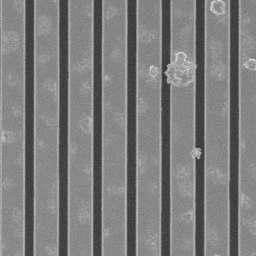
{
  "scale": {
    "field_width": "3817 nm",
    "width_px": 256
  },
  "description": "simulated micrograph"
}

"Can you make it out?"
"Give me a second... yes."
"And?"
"parallel lines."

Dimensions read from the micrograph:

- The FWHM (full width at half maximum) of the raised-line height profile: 0.354 microns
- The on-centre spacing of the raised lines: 508 nm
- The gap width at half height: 9.88 px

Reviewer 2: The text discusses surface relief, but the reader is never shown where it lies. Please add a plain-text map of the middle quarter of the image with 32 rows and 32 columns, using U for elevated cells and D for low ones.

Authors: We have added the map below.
DUUUUUUDDDUUUUUDDDUUUUUUDDUUUUUU
DUUUUUUDDDUUUUUDDDUUUUUUDDUUUUUU
DUUUUUUDDDUUUUUDDDUUUUUUDUUUUUUU
DUUUUUUDDDUUUUUDDDUUUUUUDDUUUUUU
DUUUUUUDDDUUUUUDDDUUUUUUDDUUUUUU
DUUUUUUDDDUUUUUDDDUUUUUUDDDUUUUU
DUUUUUUDDDUUUUUDDDUUUUUUDDDUUUUU
DUUUUUUDDDUUUUUDDDUUUUUUDDDUUUUU
DUUUUUUDDDUUUUUDDDUUUUUUDDDUUUUU
DUUUUUUDDDUUUUUDDDUUUUUUDDDUUUUU
DUUUUUUDDDUUUUUDDDUUUUUUDDDUUUUU
DUUUUUUDDDUUUUUDDDUUUUUUDDDUUUUU
DUUUUUUDDDUUUUUDDDUUUUUUDDDUUUUU
DUUUUUUDDDUUUUUDDDUUUUUUDDDUUUUU
DUUUUUUDDDUUUUUDDDUUUUUUDDDUUUUU
DUUUUUUDDDUUUUUDDDUUUUUUDDDUUUUU
DUUUUUUDDDUUUUUDDDUUUUUUDDDUUUUU
DUUUUUUDDDUUUUUDDDUUUUUUDDDUUUUU
DUUUUUUDDDUUUUUDDDUUUUUUDDDUUUUU
DUUUUUUDDDUUUUUDDDUUUUUUDDDUUUUU
DUUUUUUDDDUUUUUDDDUUUUUUDDDUUUUU
DUUUUUUDDDUUUUUDDDUUUUUUDDDUUUUU
DUUUUUUDDDUUUUUDDDUUUUUUDDDUUUUU
DUUUUUUDDDUUUUUDDDUUUUUUDDDUUUUU
DUUUUUUDDDUUUUUDDDUUUUUUDDDUUUUU
DUUUUUUDDDUUUUUDDDUUUUUUDDDUUUUU
DUUUUUUDDDUUUUUDDDUUUUUUDDDUUUUU
DUUUUUUDDDUUUUUDDDUUUUUUDDDUUUUU
DUUUUUUDDDUUUUUDDDUUUUUUDDDUUUUU
DUUUUUUDDDUUUUUDDDUUUUUUDDDUUUUU
DUUUUUUDDDUUUUUDDDUUUUUUDDDUUUUU
DUUUUUUDDDUUUUUDDDUUUUUUDDDUUUUU